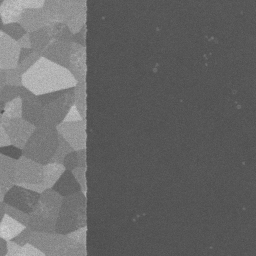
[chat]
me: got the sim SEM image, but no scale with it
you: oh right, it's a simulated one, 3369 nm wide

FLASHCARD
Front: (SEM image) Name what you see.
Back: one or a few lines or trenches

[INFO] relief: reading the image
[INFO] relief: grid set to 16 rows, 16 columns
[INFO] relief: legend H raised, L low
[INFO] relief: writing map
HHHHHLLLLLLLLLLL
HHHHHLLLLLLLLLLL
HHHHHLLLLLLLLLLL
HHHHHLLLLLLLLLLL
HHHHHLLLLLLLLLLL
HHHHHLLLLLLLLLLL
HHHHHLLLLLLLLLLL
HHHHHLLLLLLLLLLL
HHHHHLLLLLLLLLLL
HHHHHLLLLLLLLLLL
HHHHHLLLLLLLLLLL
HHHHHLLLLLLLLLLL
HHHHHLLLLLLLLLLL
HHHHHLLLLLLLLLLL
HHHHHLLLLLLLLLLL
HHHHHLLLLLLLLLLL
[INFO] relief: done